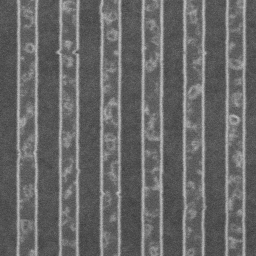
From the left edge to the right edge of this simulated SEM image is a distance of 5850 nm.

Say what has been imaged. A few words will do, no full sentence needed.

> parallel lines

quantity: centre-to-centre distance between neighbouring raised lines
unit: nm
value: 951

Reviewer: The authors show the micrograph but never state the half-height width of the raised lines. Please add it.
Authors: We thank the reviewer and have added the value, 0.406 micrometres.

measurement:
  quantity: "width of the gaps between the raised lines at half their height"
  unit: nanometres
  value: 540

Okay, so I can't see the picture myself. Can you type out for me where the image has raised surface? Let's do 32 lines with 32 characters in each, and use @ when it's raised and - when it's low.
--@@@---@@---@@---@@---@@---@@@-
--@@@---@@---@@---@@---@@---@@@-
--@@@---@@---@@---@@---@@---@@@-
--@@@---@@---@@---@@---@@---@@@-
--@@@---@@---@@---@@---@@----@@-
--@@@---@@---@@---@@---@@---@@@-
--@@@--@@@---@@---@@---@@---@@@-
--@@@---@@---@@---@@---@@---@@@-
--@@@---@@---@@---@@---@@---@@--
--@@@---@@---@@---@@---@@---@@--
--@@@---@@---@@---@@---@@----@--
--@@@---@@---@@---@@---@@----@--
--@@@---@@---@@---@@---@@---@@--
--@@@---@@---@@---@@---@@---@@--
--@@@---@@---@@---@@---@@---@@--
--@@@---@@---@@---@@---@@---@@--
--@@----@@---@@---@@---@@---@@--
--@@----@@---@@---@@---@@---@@--
--@@----@@---@@---@@---@@---@@--
--@@----@@---@@---@@---@@---@@--
--@@----@@---@@---@@---@@---@@--
--@@----@@---@@---@@---@@---@@--
--@@----@@---@@---@@---@@---@@--
--@@----@@---@@---@@---@@---@@--
--@@----@@---@@---@@---@@---@@--
--@@----@@---@@---@@---@@---@@--
--@@----@@---@@---@@---@@---@@--
--@@----@@---@@---@@---@@---@@--
--@@----@@---@@---@@---@@---@@--
--@@----@@---@@---@@---@@---@@--
--@@----@@---@@---@@---@@---@@--
--@@----@@---@@---@@---@@---@@--